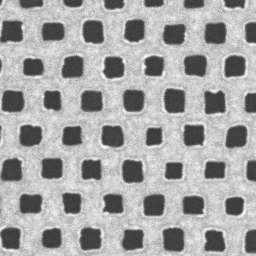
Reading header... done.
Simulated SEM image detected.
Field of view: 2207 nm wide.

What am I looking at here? a regular array of holes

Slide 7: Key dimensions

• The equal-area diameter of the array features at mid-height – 197 nanometres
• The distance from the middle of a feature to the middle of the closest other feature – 334 nm